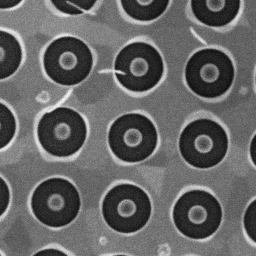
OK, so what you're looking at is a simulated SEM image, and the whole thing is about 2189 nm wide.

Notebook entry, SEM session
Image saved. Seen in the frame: an array of small figures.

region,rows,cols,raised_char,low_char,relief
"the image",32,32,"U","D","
DDUUUUDDDDDDUUUDDDDDDUUUDDUUDDUU
UUUUUUUDDDUUUUUDDDDDUUUUDDDDDDUU
UUUUUUUUUUUUUUUUUDDUUUUUDDDDDUUU
UUUUUUUUUUUUUUUUUUUUUUUUUUUDUUUU
DDUUUUUUDUUUUUUUUUUUUUUUUUUUUUUU
DDDUUUDDDDDUUUUUDDDUUUUUUUUUUUUU
DDDUUDDDDDDDUUUDDDDDUUUUDDDDUUUU
DDDUUDDDUDDDUUDDDUDDUUUUDDDDDUUU
DDUUUDDDUDDUUUDDUUDDDUUDDUUDDUUU
DUUUUUDDDDDUUUDDDDDDUUUDDUUDDUUU
UUUUUUUDDDUUUUUDDDDDUUUDDDDDDUUU
UUUUUUUUUUUUUUUUDDUUUUUUDDDDUUUU
UUUUUUUUUUUUUUUUUUUUUUUUUUUUUUUU
DUUUUUUDDUUUUUUUUUUUUUUUUUUUUUUU
DDUUUDDDDDUUUUUDDDUUUUUUUDUUUUUU
DDUUUDDDDDDUUUDDDDDUUUUDDDDDUUUU
DDUUDDDUUDDUUUDDUDDDUUUDDDDDUUUU
DUUUUDDDDDDUUUDDUDDDUUDDDUDDDUUD
DUUUUDDDDDUUUUDDDDDDUUDDDUDDUUUD
UUUUUUDDDUUUUUDDDDDUUUUDDDDDUUUD
UUUUUUUUUUUUUUUUUUUUUUUUDDDUUUUU
UUUUUUUUUUUUUUUUUUUUUUUUUUUUUUUU
DUUUUUDDUUUUUUUUUUUUUUUUUUUUUUUU
DUUUDDDDDUUUUUDDDUUUUUUUDUUUUUUU
DUUUDDDDDDUUUDDDDDDUUUDDDDDUUUUU
DUUUDDUUDDUUUDDUUDDUUUDDDDDUUUUD
DUUUDDDDDDUUUDDUUDDUUDDDUUDDUUUD
UUUUUDDDDUUUUDDDDDDUUUDDUDDDUUDD
UUUUUUUUUUUUUUDDDDUUUUDDDDDUUUDD
UUUUUUUUUUUUUUUUUUUUUUUDDDUUUUUD
UUUUUUUUUUUUUUUUUUUUUUUUUUUUUUUU
UUUUUDDDUUUUUUUUUUUUUUUUUUUUUUUU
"